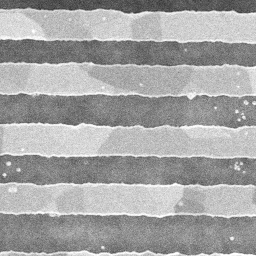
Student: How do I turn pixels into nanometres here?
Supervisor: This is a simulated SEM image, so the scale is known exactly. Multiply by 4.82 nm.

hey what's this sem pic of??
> lines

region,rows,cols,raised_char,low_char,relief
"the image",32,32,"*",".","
................................
***************...*...*******...
********************************
********************************
********************************
................................
................................
................................
********************************
********************************
********************************
********************************
................................
................................
................................
...**.....*.....................
********************************
********************************
********************************
.....*******....****************
................................
................................
................................
********************************
********************************
********************************
********************************
................................
................................
................................
................................
..........*.......*.............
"